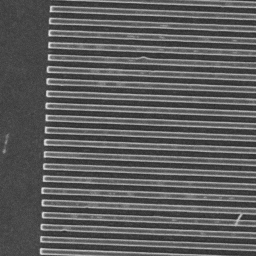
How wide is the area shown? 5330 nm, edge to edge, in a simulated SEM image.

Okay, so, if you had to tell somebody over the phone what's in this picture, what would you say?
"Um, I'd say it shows parallel lines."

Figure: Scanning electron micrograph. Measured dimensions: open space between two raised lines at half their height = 143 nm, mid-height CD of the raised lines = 125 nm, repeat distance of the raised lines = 253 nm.